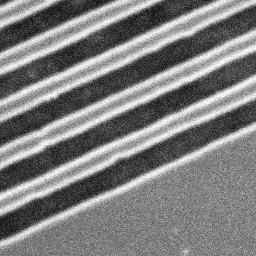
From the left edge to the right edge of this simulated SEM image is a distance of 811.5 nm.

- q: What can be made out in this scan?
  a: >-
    parallel lines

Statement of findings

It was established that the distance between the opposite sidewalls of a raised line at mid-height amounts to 52.9 nanometres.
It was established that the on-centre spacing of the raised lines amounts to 135 nm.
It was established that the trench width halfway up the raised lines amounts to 81 nm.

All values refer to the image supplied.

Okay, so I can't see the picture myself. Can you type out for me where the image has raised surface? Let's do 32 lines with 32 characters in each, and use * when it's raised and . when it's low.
.*****........*****........****.
****........*****.......*****...
**.......*****........*****.....
.......*****........*****.......
.....*****........*****........*
...*****........*****.......****
.*****........****........*****.
****........****........*****...
*........*****........*****.....
.......*****........*****.......
.....*****........*****.......**
...*****.......*****........****
.*****.......*****........*****.
***........*****........*****...
*........*****.......******.....
.......*****........****........
.....*****........****........**
..*****........*****........****
*****........*****........******
***........****.........********
*........*****.......***********
.......****........*************
.....****........***************
..*****........*****************
*****........*******************
***.......**********************
........************************
......**************************
....****************************
..******************************
********************************
********************************